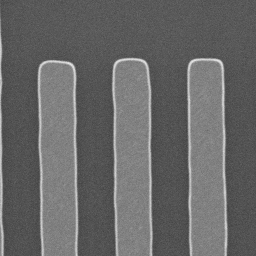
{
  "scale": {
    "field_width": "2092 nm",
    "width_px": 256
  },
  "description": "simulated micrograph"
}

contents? groups of lines, slits or small figures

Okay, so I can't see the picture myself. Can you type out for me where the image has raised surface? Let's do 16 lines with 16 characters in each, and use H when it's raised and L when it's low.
LLLLLLLLLLLLLLLL
LLLLLLLLLLLLLLLL
LLLLLLLLLLLLLLLL
LLLLLLLLLLLLLLLL
LLHHHLLHHLLLHHLL
LLHHHLLHHLLLHHLL
LLHHHLLHHLLLHHLL
LLHHHLLHHLLLHHLL
LLHHHLLHHLLLHHLL
LLHHHLLHHLLLHHLL
LLLHHLLHHLLLHHLL
LLLHHLLHHLLLHHLL
LLLHHLLHHLLLHHLL
LLLHHLLHHLLLHHLL
LLLHHLLHHLLLHHLL
LLLHHLLHHLLLHHLL